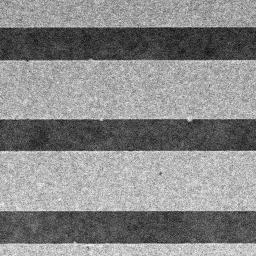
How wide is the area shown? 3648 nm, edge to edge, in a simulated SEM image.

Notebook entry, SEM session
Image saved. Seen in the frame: one or a few lines or trenches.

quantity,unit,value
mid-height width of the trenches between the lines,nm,477